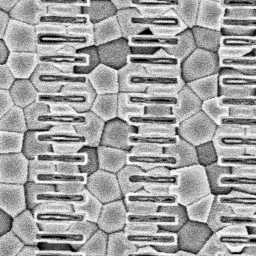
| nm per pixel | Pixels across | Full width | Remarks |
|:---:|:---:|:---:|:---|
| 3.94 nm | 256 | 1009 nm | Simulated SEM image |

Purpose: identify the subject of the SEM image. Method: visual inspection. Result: a regular array of holes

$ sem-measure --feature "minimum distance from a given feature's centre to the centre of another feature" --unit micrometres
0.0777